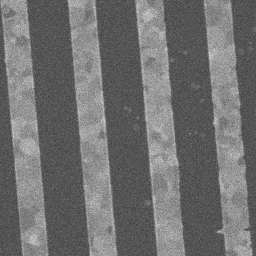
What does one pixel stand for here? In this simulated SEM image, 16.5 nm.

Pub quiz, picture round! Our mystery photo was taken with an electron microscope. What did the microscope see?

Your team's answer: one or a few lines or trenches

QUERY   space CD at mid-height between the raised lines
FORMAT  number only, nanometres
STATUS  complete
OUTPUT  689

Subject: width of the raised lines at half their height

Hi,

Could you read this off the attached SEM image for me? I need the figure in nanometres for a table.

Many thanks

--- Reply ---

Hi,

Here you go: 420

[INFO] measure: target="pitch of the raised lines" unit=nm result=1110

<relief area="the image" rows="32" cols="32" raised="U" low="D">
UUUDDDDDDUUUDDDDDUUUDDDDDDUUUDDD
UUUDDDDDDUUUDDDDDUUUDDDDDDUUUDDD
UUUDDDDDDUUUDDDDDUUUDDDDDDUUUDDD
UUUUDDDDDUUUDDDDDUUUUDDDDDUUUDDD
DUUUDDDDDUUUDDDDDUUUUDDDDDUUUDDD
DUUUDDDDDUUUDDDDDUUUUDDDDDUUUDDD
DUUUDDDDDUUUDDDDDDUUUDDDDDUUUDDD
DUUUDDDDDUUUDDDDDDUUUDDDDDUUUDDD
DUUUDDDDDUUUUDDDDDUUUDDDDDUUUDDD
DUUUDDDDDUUUUDDDDDUUUDDDDDUUUUDD
DUUUDDDDDUUUUDDDDDUUUDDDDDUUUUDD
DUUUDDDDDDUUUDDDDDUUUDDDDDDUUUDD
DUUUDDDDDDUUUDDDDDUUUDDDDDDUUUDD
DUUUDDDDDDUUUDDDDDUUUDDDDDDUUUDD
DUUUDDDDDDUUUDDDDDUUUUDDDDDUUUDD
DUUUUDDDDDUUUDDDDDUUUUDDDDDUUUDD
DDUUUDDDDDUUUDDDDDUUUUDDDDDUUUDD
DDUUUDDDDDUUUDDDDDDUUUDDDDDUUUDD
DDUUUDDDDDUUUDDDDDDUUUDDDDDUUUDD
DDUUUDDDDDUUUDDDDDDUUUDDDDDUUUDD
DDUUUDDDDDUUUUDDDDDUUUDDDDDUUUUD
DDUUUDDDDDUUUUDDDDDUUUDDDDDUUUUD
DDUUUDDDDDUUUUDDDDDUUUDDDDDUUUUD
DDUUUDDDDDDUUUDDDDDUUUDDDDDDUUUD
DDUUUDDDDDDUUUDDDDDUUUDDDDDDUUUD
DDUUUDDDDDDUUUDDDDDUUUDDDDDDUUUD
DDUUUDDDDDDUUUDDDDDUUUUDDDDDUUUD
DDUUUUDDDDDUUUDDDDDUUUUDDDDDUUUD
DDDUUUDDDDDUUUDDDDDUUUUDDDDDUUUD
DDDUUUDDDDDUUUDDDDDDUUUDDDDDUUUD
DDDUUUDDDDDUUUDDDDDDUUUDDDDDUUUD
DDDUUUDDDDDUUUUDDDDDUUUDDDDDUUUD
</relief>